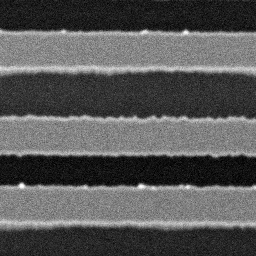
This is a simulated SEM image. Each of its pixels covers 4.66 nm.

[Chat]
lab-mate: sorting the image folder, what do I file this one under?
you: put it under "lines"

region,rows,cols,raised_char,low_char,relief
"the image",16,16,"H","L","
LLLLLLLLLLLLLLLL
LLLLLLLLLLLLLLLL
HHHHHHHHHHHHHHHH
HHHHHHHHHHHHHHHH
LLLLLLLLLLLLLLLL
LLLLLLLLLLLLLLLL
LLLLLLLLLLLLLLLL
HHHHHHHHHHHHHHHH
HHHHHHHHHHHHHHHH
HHHHHHHHHHHHHHHH
LLLLLLLLLLLLLLLL
LLLLLLLLLLLLLLLL
HHHHHHHHHHHHHHHH
HHHHHHHHHHHHHHHH
LLLLLLLLLLLLLLLL
LLLLLLLLLLLLLLLL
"